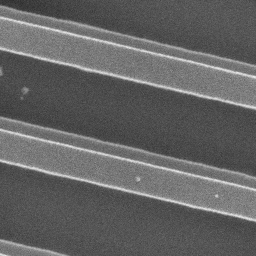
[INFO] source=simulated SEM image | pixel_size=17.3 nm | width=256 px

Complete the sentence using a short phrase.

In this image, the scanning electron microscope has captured lines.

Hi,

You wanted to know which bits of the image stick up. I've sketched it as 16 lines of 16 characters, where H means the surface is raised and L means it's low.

LLLLLLLLLLLLLLLL
HHHHHLLLLLLLLLLL
HHHHHHHHHLLLLLLL
LLHHHHHHHHHHHLLL
LLLLLLHHHHHHHHHH
LLLLLLLLLLHHHHHH
LLLLLLLLLLLLLLLH
HLLLLLLLLLLLLLLL
HHHHHLLLLLLLLLLL
HHHHHHHHHLLLLLLL
LLHHHHHHHHHHHLLL
LLLLLLHHHHHHHHHH
LLLLLLLLLLHHHHHH
LLLLLLLLLLLLLLLH
LLLLLLLLLLLLLLLL
HHLLLLLLLLLLLLLL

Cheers